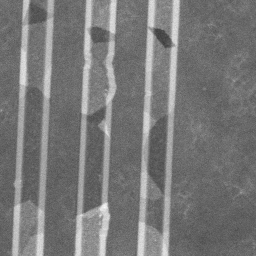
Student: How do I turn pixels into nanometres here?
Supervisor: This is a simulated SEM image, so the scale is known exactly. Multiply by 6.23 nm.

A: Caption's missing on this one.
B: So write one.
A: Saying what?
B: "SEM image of parallel lines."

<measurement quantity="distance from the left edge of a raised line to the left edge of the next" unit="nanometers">390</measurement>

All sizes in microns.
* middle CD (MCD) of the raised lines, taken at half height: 0.148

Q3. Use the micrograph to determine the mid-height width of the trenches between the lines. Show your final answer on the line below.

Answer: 244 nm